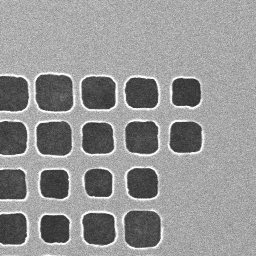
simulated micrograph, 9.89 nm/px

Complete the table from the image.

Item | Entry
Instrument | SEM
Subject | a regular array of holes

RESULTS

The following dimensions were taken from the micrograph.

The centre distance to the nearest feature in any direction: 43.6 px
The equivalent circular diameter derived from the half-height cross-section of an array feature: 340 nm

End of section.